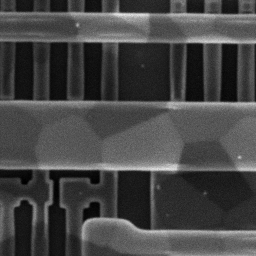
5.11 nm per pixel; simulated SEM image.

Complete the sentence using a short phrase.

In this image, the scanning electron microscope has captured wiring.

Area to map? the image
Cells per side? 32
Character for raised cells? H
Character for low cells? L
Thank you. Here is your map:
LLLLLLLLLLLLLLLLLLLLLLLLLLLLLLLL
LLLLLLLLLLLLLLLLLLLLLLLLLLLLLLLL
HHHHHHHHHHHHHHHHHHHHHHHHHHHHHHHH
HHHHHHHHHHHHHHHHHHHHHHHHHHHHHHHH
HHHHHHHHHHHHHHHHHHHHHHHHHHHHHHHH
LLLLLLLLLLLLLLLLLLLLLLLLLLLLLLLL
LLLLLLLLLLLLLLLLLLLLLLLLLLLLLLLL
LLLLLLLLLLLLLLLLLLLLLLLLLLLLLLLL
LLLLLLLLLLLLLLLLLLLLLLLLLLLLLLLL
LLLLLLLLLLLLLLLLLLLLLLLLLLLLLLLL
LLLLLLLLLLLLLLLLLLLLLLLLLLLLLLLL
LLLLLLLLLLLLLLLLLLLLLLLLLLLLLLLL
LLLLLLLLLLLLLLLLLLLLLLLLLLLLLLLL
HHHHHHHHHHHHHHHHHHHHHHHHHHHHHHHH
HHHHHHHHHHHHHHHHHHHHHHHHHHHHHHHH
HHHHHHHHHHHHHHHHHHHHHHHHHHHHHHHH
HHHHHHHHHHHHHHHHHHHHHHHHHHHHHHHH
HHHHHHHHHHHHHHHHHHHHHHHHHHHHHHHH
HHHHHHHHHHHHHHHHHHHHHHHHHHHHHHHH
HHHHHHHHHHHHHHHHHHHHHHHHHHHHHHHH
HHHHHHHHHHHHHHHHHHHHHHHHHHHHHHHH
LLLLLLLLLLLLLLLLLLLLLLLLLLLLLLLL
LLLLLLLLLLLLLLLLLLLLLLLLLLLLLLLL
LLLLLLLLLLLLLLLLLLLLLLLLLLLLLLLL
LLLLLLLLLLLLLLLLLLLLLLLLLLLLLLLL
LLLLLLLLLLLLLLLLLLLLLLLLLLLLLLLL
LLLLLLLLLLLLLLLLLLLLLLLLLLLLLLLL
LLLLLLLLLLLHHHHHLLLLLLLLLLLLLLLL
LLLLLLLLLLHHHHHHHLLLLLLLLLLLLLLL
LLLLLLLLLLHHHHHHHHHHHHHHHHHHHHHH
LLLLLLLLLLHHHHHHHHHHHHHHHHHHHHHH
LLLLLLLLLLHHHHHHHHHHHHHHHHHHHHHH